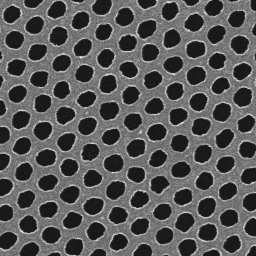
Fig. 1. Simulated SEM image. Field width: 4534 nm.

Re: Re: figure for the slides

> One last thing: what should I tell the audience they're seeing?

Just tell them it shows a regular array of holes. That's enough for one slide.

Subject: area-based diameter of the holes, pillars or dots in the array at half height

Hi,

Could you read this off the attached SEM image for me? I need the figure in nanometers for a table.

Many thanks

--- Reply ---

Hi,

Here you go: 312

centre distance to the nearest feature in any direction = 0.446 micrometres